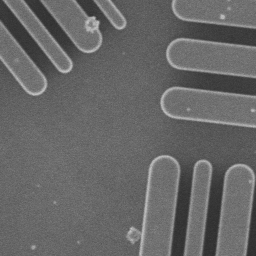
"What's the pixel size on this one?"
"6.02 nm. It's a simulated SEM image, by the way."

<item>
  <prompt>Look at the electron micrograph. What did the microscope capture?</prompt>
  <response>groups of lines, slits or small figures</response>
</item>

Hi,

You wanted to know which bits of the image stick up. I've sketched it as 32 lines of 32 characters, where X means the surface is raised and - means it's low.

-XX--XXXXX--XX--------XXXXXXXXXX
--XX--XXXXX--XX-------XXXXXXXXXX
--XXX--XXXXX--XX-------XXXXXXXXX
X--XXX--XXXX-------------------X
XX--XX---XXXX-------------------
XX---XX--XXXX--------XXXXXXXX---
XXX---XX-------------XXXXXXXXXXX
XXXX--XXX------------XXXXXXXXXXX
-XXXX--XX-------------XXXXXXXXXX
--XXX-------------------------XX
---XXX--------------------------
---XX----------------XXXXXXX----
--------------------XXXXXXXXXXXX
--------------------XXXXXXXXXXXX
---------------------XXXXXXXXXXX
-----------------------------XXX
--------------------------------
--------------------------------
--------------------------------
--------------------X-----------
-------------------XXX---X------
-------------------XXX--XX--XXXX
-------------------XXX--XX--XXXX
------------------XXXX--XX--XXXX
------------------XXXX--XX--XXXX
------------------XXXX--XX--XXX-
------------------XXXX--XX--XXX-
------------------XXXX-XXX-XXXX-
------------------XXXX-XXX-XXXX-
------------------XXXX-XX--XXXX-
------------------XXX--XX--XXXX-
-----------------XXXX--XX--XXXX-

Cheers